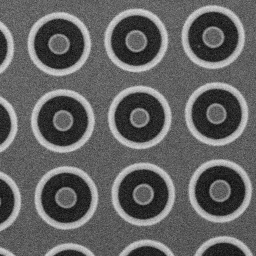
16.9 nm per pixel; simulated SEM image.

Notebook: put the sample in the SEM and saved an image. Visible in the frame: an array of small figures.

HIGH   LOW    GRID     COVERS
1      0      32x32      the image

11111111111111111111111111111111
11111111111111111111111110001111
11111100011111100001111100000111
11111000001111000000111000000011
01110001000111001100011000110011
01110011100111001100011000100011
01110001000111000000111100000011
01111000001111100001111110000111
11111100011111110011111111111111
11111111111111111111111111111111
11111111111111111111111111111111
11111111111111110001111110000111
11111000001111100000111100000011
01111000000111000000011100000001
00110001100111000100011100000001
00110001100111000100011100000011
00111000000111000000111100000011
01111000001111100000111111001111
11111110011111111111111111111111
11111111111111111111111111111111
11111111111111111111111111000111
11111110001111110000111110000011
01111100000111100000011100000001
00111000000011000110011100111001
00111000000011000110011100010001
00111000000011100000011100000001
00111000000111100000011110000011
01111100001111110001111111111111
11111111111111111111111111111111
11111111111111111111111111111111
11111111111111111001111111000011
11111110000111110000011110000001